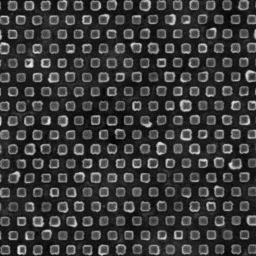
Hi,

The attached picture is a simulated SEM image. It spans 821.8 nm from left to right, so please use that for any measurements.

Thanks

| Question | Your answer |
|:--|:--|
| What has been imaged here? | a regular array of raised bodies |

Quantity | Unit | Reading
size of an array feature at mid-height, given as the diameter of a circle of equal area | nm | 32.2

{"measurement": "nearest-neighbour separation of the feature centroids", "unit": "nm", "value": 51.6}